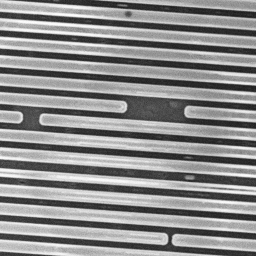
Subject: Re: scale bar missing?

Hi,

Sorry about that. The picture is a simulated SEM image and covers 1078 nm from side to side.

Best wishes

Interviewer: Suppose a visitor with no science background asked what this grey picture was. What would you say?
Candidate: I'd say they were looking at parallel lines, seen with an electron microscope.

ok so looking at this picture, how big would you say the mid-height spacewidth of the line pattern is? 30.4 nanometres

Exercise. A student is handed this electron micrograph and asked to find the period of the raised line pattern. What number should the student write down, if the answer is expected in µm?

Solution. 0.0775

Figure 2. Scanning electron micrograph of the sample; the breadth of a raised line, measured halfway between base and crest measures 0.0493 µm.